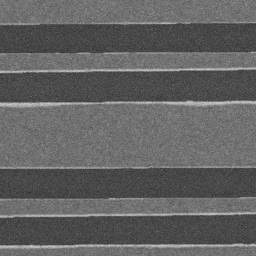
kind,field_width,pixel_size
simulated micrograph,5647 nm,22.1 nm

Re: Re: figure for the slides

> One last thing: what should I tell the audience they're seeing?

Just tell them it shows lines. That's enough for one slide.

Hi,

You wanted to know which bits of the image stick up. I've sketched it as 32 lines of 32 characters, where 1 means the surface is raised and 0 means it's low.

11111111111111111111111111111111
11111111111111111111111111111111
11111111111111111111111111111111
00000000000000000000000000000000
00000000000000000000000000000000
00000000000000000000000000000000
00000000000000000000000000000000
11111111111111111111111111111111
11111111111111111111111111111111
00000000000000000000000000000000
00000000000000000000000000000000
00000000000000000000000000000000
00000000000000000000000000000000
11111111111111111111111111111111
11111111111111111111111111111111
11111111111111111111111111111111
11111111111111111111111111111111
11111111111111111111111111111111
11111111111111111111111111111111
11111111111111111111111111111111
11111111111111111111111111111111
00000000000000000000000000000000
00000000000000000000000000000000
00000000000000000000000000000000
00000000000000000000000000000000
11111111111111111111111111111111
11111111111111111111111111111111
00000000000000000000000000000000
00000000000000000000000000000000
00000000000000000000000000000000
00000000000000000000000000000000
11111111111111111111111111111111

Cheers